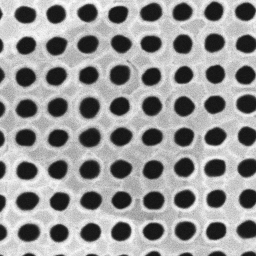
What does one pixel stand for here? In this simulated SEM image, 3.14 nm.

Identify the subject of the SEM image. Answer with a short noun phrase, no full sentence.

a regular array of holes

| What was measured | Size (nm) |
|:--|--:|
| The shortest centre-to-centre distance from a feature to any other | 95.9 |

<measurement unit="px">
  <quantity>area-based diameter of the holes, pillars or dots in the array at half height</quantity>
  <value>18.2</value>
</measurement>